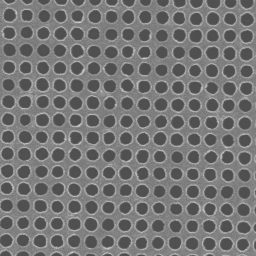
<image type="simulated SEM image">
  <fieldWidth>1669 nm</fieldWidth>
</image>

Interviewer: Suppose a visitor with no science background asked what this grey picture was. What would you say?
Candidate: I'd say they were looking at a regular array of holes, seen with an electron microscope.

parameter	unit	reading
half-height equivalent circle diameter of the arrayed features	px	11.8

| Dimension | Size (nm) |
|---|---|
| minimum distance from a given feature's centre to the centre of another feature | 109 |